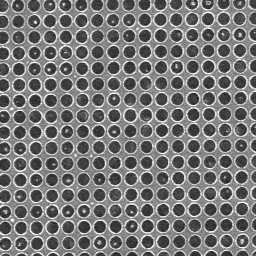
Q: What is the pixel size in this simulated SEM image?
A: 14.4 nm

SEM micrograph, a regular array of holes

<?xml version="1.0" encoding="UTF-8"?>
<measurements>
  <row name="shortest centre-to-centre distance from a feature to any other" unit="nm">225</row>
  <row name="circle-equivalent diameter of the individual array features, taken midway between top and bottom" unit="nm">184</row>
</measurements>